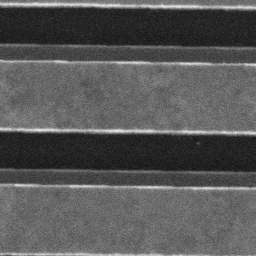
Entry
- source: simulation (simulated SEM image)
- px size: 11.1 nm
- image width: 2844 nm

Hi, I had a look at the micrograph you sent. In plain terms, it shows lines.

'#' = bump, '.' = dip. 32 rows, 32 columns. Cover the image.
################################
................................
................................
................................
................................
................................
................................
................................
################################
################################
################################
################################
################################
################################
################################
################################
......................##########
................................
................................
................................
................................
................................
................................
################################
################################
################################
################################
################################
################################
################################
################################
################################